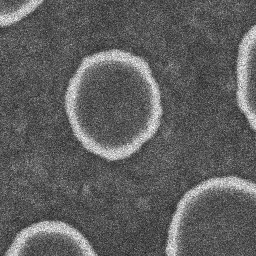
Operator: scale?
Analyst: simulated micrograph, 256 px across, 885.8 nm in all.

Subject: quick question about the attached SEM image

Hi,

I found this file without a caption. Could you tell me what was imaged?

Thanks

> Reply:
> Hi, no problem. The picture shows raised bodies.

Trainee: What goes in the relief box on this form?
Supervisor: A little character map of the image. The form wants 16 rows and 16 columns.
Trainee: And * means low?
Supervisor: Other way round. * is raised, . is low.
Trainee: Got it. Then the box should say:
**..............
................
................
......**.......*
.....****......*
.....*****.....*
....******.....*
....******......
.....****.......
......**........
................
.............**.
............****
...........*****
..***......*****
.****......*****